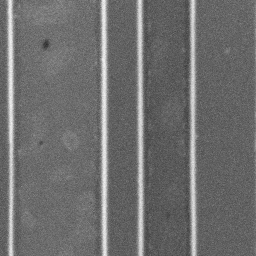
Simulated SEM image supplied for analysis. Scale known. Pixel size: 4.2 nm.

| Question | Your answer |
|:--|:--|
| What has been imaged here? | one or a few lines or trenches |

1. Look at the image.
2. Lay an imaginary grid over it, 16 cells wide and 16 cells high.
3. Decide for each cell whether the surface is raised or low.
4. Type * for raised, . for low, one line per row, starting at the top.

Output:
*......**...****
*......**...****
*......**...****
*.....***...****
*......**...****
*......**...****
*......**...****
*.....***...****
*......**...****
*......**...****
*......**...****
*.....***...****
*.....***...****
*.....***...****
*......**...****
*......**...****